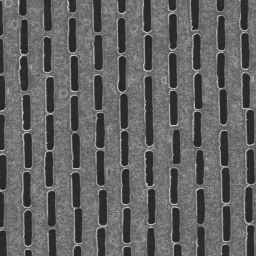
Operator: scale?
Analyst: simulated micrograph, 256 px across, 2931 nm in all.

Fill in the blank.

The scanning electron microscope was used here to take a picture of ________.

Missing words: a regular array of holes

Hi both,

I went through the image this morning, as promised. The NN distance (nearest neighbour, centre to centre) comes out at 344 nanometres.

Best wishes